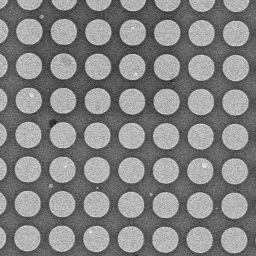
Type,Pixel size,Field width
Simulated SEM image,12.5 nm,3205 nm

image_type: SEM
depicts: an array of small figures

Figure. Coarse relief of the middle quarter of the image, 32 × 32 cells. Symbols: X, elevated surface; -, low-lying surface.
XXX--XXXXXXX--XXXXXX---XXXXXX--X
XXX--XXXXXX---XXXXXX---XXXXXX--X
XX----XXXXX---XXXXXX---XXXXX----
X------XXX------XXX-----XXX-----
--------------------------------
--------------------------------
X------XXX------XX------XXX-----
XX----XXXXX---XXXXXX---XXXXX----
XXX--XXXXXX---XXXXXX---XXXXXX--X
XXX--XXXXXXX--XXXXXX---XXXXXX--X
XXX--XXXXXX---XXXXXX---XXXXXX--X
XX----XXXXX----XXXX----XXXXX----
----------------XX-------X------
--------------------------------
--------------------------------
XX----XXXX-----XXXX-----XXX-----
XXX--XXXXXX---XXXXXX---XXXXX---X
XXX--XXXXXX---XXXXXX--XXXXXXX--X
XXX--XXXXXX---XXXXXX--XXXXXXX--X
XX----XXXXX---XXXXXX---XXXXX---X
XX----XXXX-----XXXX----XXXXX----
--------------------------------
--------------------------------
X------XX-----------------------
XX----XXXXX---XXXXX----XXXXX----
XXX--XXXXXX---XXXXXX---XXXXX---X
XXX--XXXXXX---XXXXXX--XXXXXXX--X
XXX--XXXXXX---XXXXXX--XXXXXXX--X
XX----XXXXX---XXXXX----XXXXX---X
-------XX-------XX------XXX-----
--------------------------------
--------------------------------